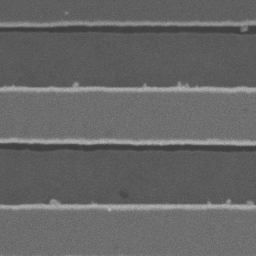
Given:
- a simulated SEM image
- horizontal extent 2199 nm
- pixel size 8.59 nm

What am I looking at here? lines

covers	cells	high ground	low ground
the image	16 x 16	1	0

1111111111111111
1111111111111111
0000000000000000
0000000000000000
0000000000000000
1000011000010000
1111111111111111
1111111111111111
1111111111111111
0000000000000000
0000000000000000
0000000000000000
0000000000000000
1111111111111111
1111111111111111
1111111111111111